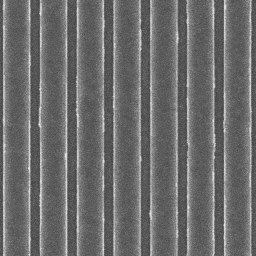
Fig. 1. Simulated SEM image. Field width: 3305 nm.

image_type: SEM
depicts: parallel lines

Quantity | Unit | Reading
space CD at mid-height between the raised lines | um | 0.131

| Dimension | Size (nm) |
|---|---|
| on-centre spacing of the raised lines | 474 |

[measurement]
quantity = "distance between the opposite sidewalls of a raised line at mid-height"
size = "347 nanometres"